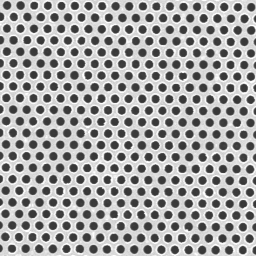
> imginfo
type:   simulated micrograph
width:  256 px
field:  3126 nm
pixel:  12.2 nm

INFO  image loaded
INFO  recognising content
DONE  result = a regular array of holes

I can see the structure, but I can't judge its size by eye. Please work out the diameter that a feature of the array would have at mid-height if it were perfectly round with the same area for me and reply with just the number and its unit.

8.3 pixels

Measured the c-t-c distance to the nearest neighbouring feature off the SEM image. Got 161 nm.